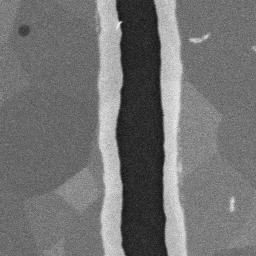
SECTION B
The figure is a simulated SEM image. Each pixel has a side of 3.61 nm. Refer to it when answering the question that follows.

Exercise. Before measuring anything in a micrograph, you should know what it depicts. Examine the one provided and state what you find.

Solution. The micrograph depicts one or a few lines or trenches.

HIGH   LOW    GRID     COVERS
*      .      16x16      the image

*******...******
*******...******
*******....*****
*******....*****
*******....*****
*******....*****
*******....*****
*******....*****
*******....*****
*******....*****
*******....*****
*******....*****
*******....*****
*******....*****
*******....*****
*******....*****